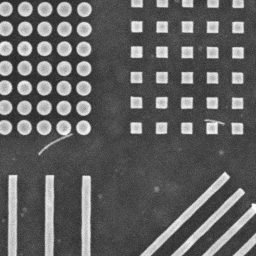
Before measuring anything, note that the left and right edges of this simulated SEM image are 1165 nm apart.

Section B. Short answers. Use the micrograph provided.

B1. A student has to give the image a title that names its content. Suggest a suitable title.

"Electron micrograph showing groups of lines, slits or small figures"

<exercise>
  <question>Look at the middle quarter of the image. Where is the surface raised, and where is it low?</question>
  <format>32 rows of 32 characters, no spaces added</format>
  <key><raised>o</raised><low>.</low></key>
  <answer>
oo.oooo.........................
oo.oooo.........................
o...oo...........oo....ooo....oo
.................oo....ooo....oo
o...o............oo....ooo....oo
oo.oooo.........................
oo.oooo.........................
o...oo..........................
.................o..............
o...o............oo....ooo....oo
oo.oooo..........oo....ooo....oo
oo.oooo.........................
o...oo..........................
................................
o...oo..........................
oo.oooo..........oo....ooo....oo
oo.oooo..........oo....ooo....oo
o...o...........................
................................
................................
................................
................................
................................
................................
................................
................................
................................
................................
.....oo.........................
.....oo.........................
.....oo.........................
.....oo.........................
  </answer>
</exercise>